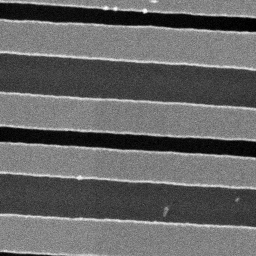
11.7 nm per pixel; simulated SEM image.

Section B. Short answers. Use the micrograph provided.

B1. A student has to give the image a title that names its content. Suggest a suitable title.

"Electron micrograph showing lines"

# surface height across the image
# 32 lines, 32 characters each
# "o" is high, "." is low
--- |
....oooooooooooooooooooooooooooo
.................ooooooooooooooo
o...............................
ooooooooooooooooooooo...........
oooooooooooooooooooooooooooooooo
oooooooooooooooooooooooooooooooo
oooooooooooooooooooooooooooooooo
..............oooooooooooooooooo
.............................ooo
................................
................................
................................
ooooooooooooooo.................
ooooooooooooooooooooooooooooooo.
oooooooooooooooooooooooooooooooo
oooooooooooooooooooooooooooooooo
............oooooooooooooooooooo
..............................oo
ooooooooooooo...................
ooooooooooooooooooooooooooooo...
oooooooooooooooooooooooooooooooo
oooooooooooooooooooooooooooooooo
.............ooooooooooooooooooo
.............................ooo
................................
................................
................................
ooooooooooooooo.................
oooooooooooooooooooooooooooooooo
oooooooooooooooooooooooooooooooo
oooooooooooooooooooooooooooooooo
oooooooooooooooooooooooooooooooo